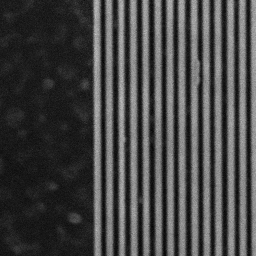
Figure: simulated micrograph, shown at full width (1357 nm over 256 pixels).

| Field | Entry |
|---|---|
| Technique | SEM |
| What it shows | parallel lines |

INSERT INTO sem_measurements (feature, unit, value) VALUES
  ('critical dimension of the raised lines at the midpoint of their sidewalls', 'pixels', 6.38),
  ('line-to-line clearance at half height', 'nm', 29.2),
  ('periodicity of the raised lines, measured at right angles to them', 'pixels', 12.1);